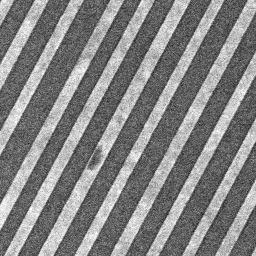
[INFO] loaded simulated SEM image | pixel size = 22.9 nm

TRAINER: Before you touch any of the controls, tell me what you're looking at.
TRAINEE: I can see parallel lines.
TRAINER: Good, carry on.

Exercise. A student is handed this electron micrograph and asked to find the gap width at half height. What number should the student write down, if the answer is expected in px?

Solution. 19.8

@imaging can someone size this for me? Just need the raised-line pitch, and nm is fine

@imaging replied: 710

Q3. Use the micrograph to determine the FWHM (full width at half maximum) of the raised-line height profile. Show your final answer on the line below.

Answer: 0.25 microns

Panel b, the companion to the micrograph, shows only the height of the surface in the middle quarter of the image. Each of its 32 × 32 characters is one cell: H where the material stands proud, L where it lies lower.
LLLHHHLLLLLHHHLLLLLHHHHLLLLLHHHL
LLHHHLLLLLHHHLLLLLLHHHLLLLLLHHLL
LLHHHLLLLLHHHLLLLLHHHHLLLLLHHHLL
LHHHHLLLLHHHLLLLLHHHHLLLLLLHHLLL
LHHHLLLLHHHHLLLLLHHHHLLLLLHHHLLL
HHHLLLLLHHHLLLLLHHHHLLLLLLHHLLLL
HHHLLLLHHHHLLLLLHHHHLLLLLHHHLLLL
HHLLLLLHHHLLLLLHHHHLLLLLHHHLLLLL
HHLLLLHHHHLLLLLHHHHLLLLLHHHLLLLL
HLLLLLHHHLLLLLHHHHLLLLLHHHLLLLLL
LLLLLHHHLLLLLLHHHLLLLLLHHHLLLLLL
LLLLLHHHLLLLLHHHHLLLLLHHHLLLLLLH
LLLLHHHLLLLLLHHHLLLLLLHHHLLLLLLH
LLLLHHHLLLLLHHHHLLLLLHHHLLLLLLHH
LLLHHHLLLLLLHHHLLLLLLHHLLLLLLLHH
LLLHHLLLLLLHHHHLLLLLHHHLLLLLLHHH
LLHHHLLLLLHHHHLLLLLLHHLLLLLLLHHH
LHHHHLLLLLHHHLLLLLLHHHLLLLLLHHHL
LHHHLLLLLHHHHLLLLLLHHLLLLLLLHHHL
HHHHLLLLLHHHLLLLLLHHHLLLLLLHHHLL
HHHLLLLLHHHHLLLLLLHHLLLLLLLHHHLL
HHHLLLLLHHHHLLLLLHHHLLLLLLHHHLLL
HHLLLLLHHHHLLLLLHHHLLLLLLHHHHLLL
HLLLLLLHHHLLLLLLHHHLLLLLLHHHLLLL
HLLLLLHHHHLLLLLHHHLLLLLLHHHHLLLL
LLLLLLHHHLLLLLLHHHLLLLLLHHHLLLLL
LLLLLHHHHLLLLLHHHLLLLLLHHHHLLLLL
LLLLLHHHLLLLLLHHHLLLLLLHHHLLLLLL
LLLLHHHHLLLLLHHHLLLLLLHHHLLLLLLH
LLLHHHHLLLLLLHHLLLLLLLHHHLLLLLLH
LLLHHHLLLLLLHHHLLLLLLHHHLLLLLLHH
LLHHHHLLLLLLHHLLLLLLLHHHLLLLLHHH